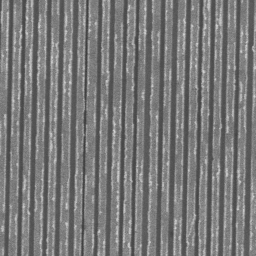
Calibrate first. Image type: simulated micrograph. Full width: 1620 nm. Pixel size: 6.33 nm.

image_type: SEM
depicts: parallel lines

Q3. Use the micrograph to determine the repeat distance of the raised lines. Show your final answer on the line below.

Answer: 0.0797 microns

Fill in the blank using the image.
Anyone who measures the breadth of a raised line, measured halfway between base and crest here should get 48.3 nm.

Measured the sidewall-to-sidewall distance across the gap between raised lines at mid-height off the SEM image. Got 32.4 nm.